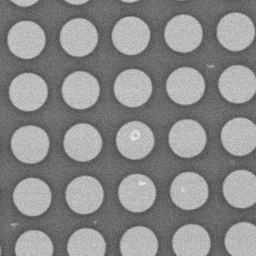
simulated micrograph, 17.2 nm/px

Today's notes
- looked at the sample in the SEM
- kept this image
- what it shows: an array of small figures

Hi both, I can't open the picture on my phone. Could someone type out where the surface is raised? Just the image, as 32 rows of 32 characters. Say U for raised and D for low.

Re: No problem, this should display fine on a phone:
DDUUDDDDDUDDDDDDDDDDDDDDDDDDDDDD
DDDDDDDDDDDDDDDDDDDDDDDDDDDDDDDD
DDDDDDDDDUUDDDDUUUDDDUUUDDDDUUUD
DUUUUDDDUUUUDDUUUUDDDUUUUDDUUUUU
DUUUUUDDUUUUDDUUUUUDDUUUUDDUUUUU
DUUUUUDDUUUUDDUUUUDDDUUUUDDDUUUD
DDUUUDDDUUUDDDDUUUDDDDDDDDDDDDDD
DDDDDDDDDDDDDDDDDDDDDDDDDDDDDDDD
DDDDDDDDDDDDDDDDDDDDDDDUDDDDDUUD
DDUUUDDDDUUUDDDUUUDDDUUUUDDDUUUU
DUUUUUDDUUUUDDUUUUUDDUUUUUDUUUUU
DUUUUUDDUUUUDDUUUUUDDUUUUDDDUUUU
DUUUUUDDUUUUDDDUUUDDDDUUUDDDUUUD
DDUUUDDDDUUDDDDDDDDDDDDDDDDDDDDD
DDDDDDDDDDDDDDDDDDDDDDDDDDDDDDDD
DDDDDDDDDDUDDDDDUUDDDDUUUDDDUUUU
DDUUUUDDUUUUDDDUUUUDDUUUUUDDUUUU
DUUUUUDDUUUUUDDUUUUDDUUUUUDDUUUU
DUUUUUDDUUUUUDDUUUUDDUUUUDDDUUUU
DDUUUUDDDUUUDDDDUUDDDDDUDDDDDDDD
DDDDDDDDDDDDDDDDDDDDDDDDDDDDDDDD
DDDDDDDDDDDDDDDDDDDDDDDDDDDDDUUD
DDDUUDDDDUUUDDDUUUUDDDUUUDDDUUUU
DDUUUUDDUUUUUDDUUUUDDUUUUUDDUUUU
DDUUUUDDUUUUUDDUUUUDDUUUUUDDUUUU
DDUUUUDDDUUUUDDUUUUDDDUUUDDDDUUU
DDDUUDDDDDUDDDDDDDDDDDDDDDDDDDDD
DDDDDDDDDDDDDDDDDDDDDDDDDDDDDDDD
DDDDDDDDDDDDDDDDDUDDDDDUUDDDDUUU
DDDUUUDDDUUUUDDUUUUDDDUUUUDDUUUU
DDUUUUUDDUUUUDDUUUUUDDUUUUDDUUUU
DDUUUUUDDUUUUDDUUUUUDDUUUUDDDUUU